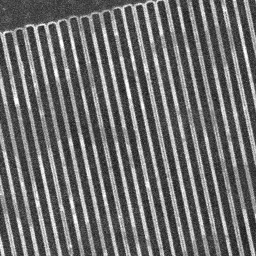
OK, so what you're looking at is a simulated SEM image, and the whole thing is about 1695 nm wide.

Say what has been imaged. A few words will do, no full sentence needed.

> parallel lines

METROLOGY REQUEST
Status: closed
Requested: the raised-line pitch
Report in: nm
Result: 73.8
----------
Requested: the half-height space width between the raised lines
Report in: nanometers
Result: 51.9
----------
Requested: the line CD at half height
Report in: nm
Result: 19.5